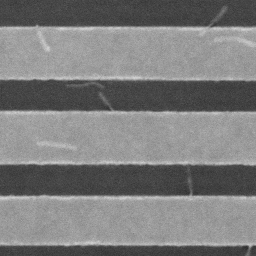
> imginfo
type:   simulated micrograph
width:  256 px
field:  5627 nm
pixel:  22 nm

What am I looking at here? lines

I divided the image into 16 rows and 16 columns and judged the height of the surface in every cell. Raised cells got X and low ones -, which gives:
----------------
----------------
XXXXXXXXXXXXXXXX
XXXXXXXXXXXXXXXX
XXXXXXXXXXXXXXXX
----------------
----------------
XXXXXXXXXXXXXXXX
XXXXXXXXXXXXXXXX
XXXXXXXXXXXXXXXX
----------------
----------------
XXXXXXXXXXXXXXXX
XXXXXXXXXXXXXXXX
XXXXXXXXXXXXXXXX
----------------